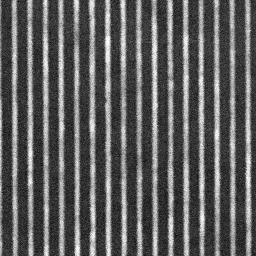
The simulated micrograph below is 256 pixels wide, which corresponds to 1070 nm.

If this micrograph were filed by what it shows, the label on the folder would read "parallel lines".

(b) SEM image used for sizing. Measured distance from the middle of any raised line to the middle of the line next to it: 65.1 nanometers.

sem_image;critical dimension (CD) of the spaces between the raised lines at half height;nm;50.7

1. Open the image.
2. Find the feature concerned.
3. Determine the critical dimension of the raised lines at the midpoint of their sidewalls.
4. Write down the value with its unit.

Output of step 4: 14.6 nm